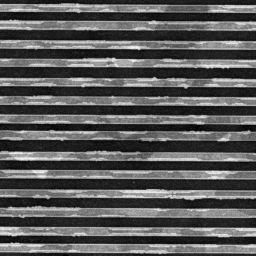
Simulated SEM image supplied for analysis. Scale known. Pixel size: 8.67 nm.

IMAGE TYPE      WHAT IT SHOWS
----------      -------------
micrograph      parallel lines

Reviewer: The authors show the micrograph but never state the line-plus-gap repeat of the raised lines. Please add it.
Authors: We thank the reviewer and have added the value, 160 nm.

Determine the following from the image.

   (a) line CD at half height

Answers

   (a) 8 pixels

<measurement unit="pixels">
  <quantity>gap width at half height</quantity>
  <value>10.7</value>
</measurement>